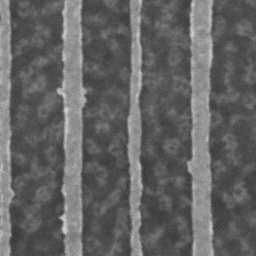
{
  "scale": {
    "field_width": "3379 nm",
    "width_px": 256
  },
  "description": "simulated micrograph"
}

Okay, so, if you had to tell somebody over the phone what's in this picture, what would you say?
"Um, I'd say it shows one or a few lines or trenches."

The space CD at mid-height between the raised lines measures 687 nm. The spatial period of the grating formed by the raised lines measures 849 nanometres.